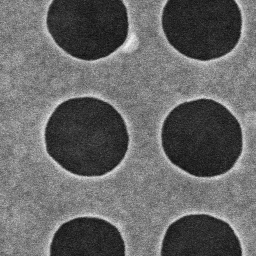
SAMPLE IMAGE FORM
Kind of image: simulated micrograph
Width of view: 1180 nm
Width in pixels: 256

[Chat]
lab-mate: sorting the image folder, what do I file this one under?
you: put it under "holes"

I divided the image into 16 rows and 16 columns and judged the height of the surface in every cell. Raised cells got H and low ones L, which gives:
HHHLLLLLHHLLLLLH
HHHLLLLLHHLLLLLH
HHHLLLLLHHLLLLLH
HHHHLLLHHHHHLLHH
HHHHHHHHHHHHHHHH
HHHHHHHHHHHHHHHH
HHHHLLLHHHHLLLHH
HHHLLLLLHHLLLLLH
HHHLLLLLHHLLLLLH
HHHLLLLLHHLLLLLH
HHHHLLLHHHHLLLHH
HHHHHHHHHHHHHHHH
HHHHHHHHHHHHHHHH
HHHHHHHHHHHHLHHH
HHHHLLLHHHLLLLLH
HHHLLLLLHHLLLLLH